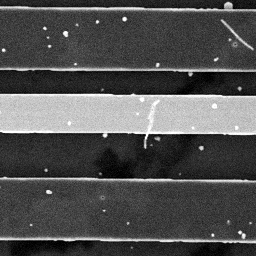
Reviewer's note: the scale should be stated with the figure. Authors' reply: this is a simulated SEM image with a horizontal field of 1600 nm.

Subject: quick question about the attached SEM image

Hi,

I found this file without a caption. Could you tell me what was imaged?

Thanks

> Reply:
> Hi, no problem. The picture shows lines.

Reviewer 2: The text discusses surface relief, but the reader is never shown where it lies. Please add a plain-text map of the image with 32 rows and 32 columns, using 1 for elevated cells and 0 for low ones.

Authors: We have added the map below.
00000000000000000000000000000000
11111111111111111111111111111111
11111111111111111111111111111111
11111111111111111111111111111111
11111111111111111111111111111111
11111111111111111111111111111111
11111111111111111111111111111111
11111111111111111111111111111111
11111111111111111111111111111111
00000000000000000000000000000000
00000000000000000000000000000000
00000000000000000000000000000000
11111111111111111111111111111111
11111111111111111111111111111111
11111111111111111111111111111111
11111111111111111111111111111111
11100111111111111111111111111111
00000000000000000000000000000000
00000000000000000000000000000000
00000000000000000000000000000000
00000000000000000000000000000000
00000000000000000000000000000000
11111111111111111100110000000000
11111111111111111111111111111111
11111111111111111111111111111111
11111111111111111111111111111111
11111111111111111111111111111111
11111111111111111111111111111111
11111111111111111111111111111111
11111111111111111111111111111111
00000000000000000000000000000000
00000000000000000000000000000000